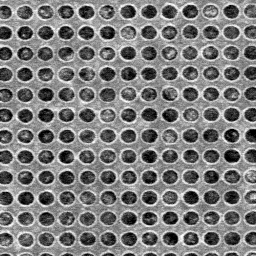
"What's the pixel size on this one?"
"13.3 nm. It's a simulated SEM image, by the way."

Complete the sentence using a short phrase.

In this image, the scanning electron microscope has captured a regular array of holes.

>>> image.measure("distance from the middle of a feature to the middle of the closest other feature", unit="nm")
268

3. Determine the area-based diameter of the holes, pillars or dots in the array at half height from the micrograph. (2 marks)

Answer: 15.7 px